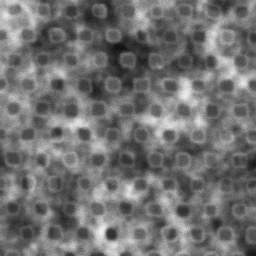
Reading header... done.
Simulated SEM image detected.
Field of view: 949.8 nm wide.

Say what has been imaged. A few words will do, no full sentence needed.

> a regular array of raised bodies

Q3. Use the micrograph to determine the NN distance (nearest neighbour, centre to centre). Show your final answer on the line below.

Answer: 103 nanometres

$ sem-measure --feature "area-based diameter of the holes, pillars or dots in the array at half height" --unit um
0.0571